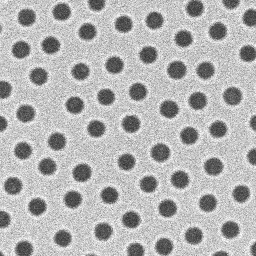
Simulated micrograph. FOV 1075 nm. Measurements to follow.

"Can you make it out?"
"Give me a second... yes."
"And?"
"a regular array of holes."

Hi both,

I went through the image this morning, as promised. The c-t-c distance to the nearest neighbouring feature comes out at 134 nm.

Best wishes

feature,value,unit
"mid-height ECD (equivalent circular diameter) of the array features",0.0774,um